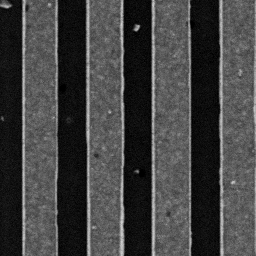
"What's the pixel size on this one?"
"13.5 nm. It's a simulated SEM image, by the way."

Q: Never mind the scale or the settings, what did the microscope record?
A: lines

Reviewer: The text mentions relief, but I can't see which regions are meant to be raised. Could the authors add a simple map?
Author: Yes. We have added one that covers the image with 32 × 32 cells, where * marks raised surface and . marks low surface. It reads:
...****....****....*****....****
...****....****....*****....****
...****....****....*****....****
...****....****....*****....****
...****....****....*****....****
...****....****....*****....****
...****....****....*****....****
...****....****....*****....****
...****....****....*****....****
...****....****....*****....****
...****....****....*****....****
...****....****....*****....****
...****....****....*****....****
...****....****....*****....****
...****....****....*****....****
...****....****....*****....****
...****....****....*****....****
...****....****....*****....****
...****....****....*****....****
...****....****....*****....****
...****....****....*****....****
...****....****....*****....****
...****....****....*****....****
...****....****....*****....****
...****....****....*****....****
...****....****....*****....****
...****....****....*****....****
...****....****....*****....****
...****....****....*****....****
...****....****....*****....****
...****....****....*****....****
...****....****....*****....****